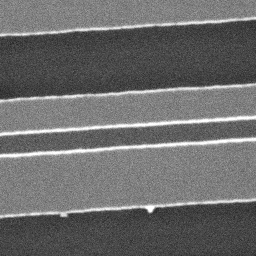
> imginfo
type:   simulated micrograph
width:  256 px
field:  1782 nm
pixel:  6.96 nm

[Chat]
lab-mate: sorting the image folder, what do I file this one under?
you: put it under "lines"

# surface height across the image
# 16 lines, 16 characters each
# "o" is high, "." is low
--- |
oooooooooooooooo
oooooooooooo....
................
................
................
.............ooo
oooooooooooooooo
oooooooooooooooo
oooooooooooooooo
oooooooooooooooo
oooooooooooooooo
oooooooooooooooo
oooooooooooooooo
o...............
................
................